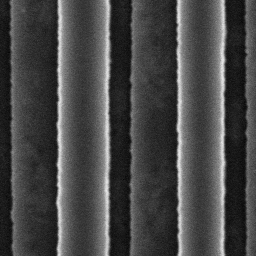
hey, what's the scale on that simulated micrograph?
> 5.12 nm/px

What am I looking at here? lines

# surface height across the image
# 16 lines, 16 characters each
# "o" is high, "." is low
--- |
....ooo....ooo..
....ooo....ooo..
....ooo....ooo..
....ooo....ooo..
....ooo....ooo..
....ooo....ooo..
....ooo....ooo..
....ooo....ooo..
....ooo....ooo..
....ooo....ooo..
....ooo....ooo..
....ooo....ooo..
....ooo....ooo..
....ooo....ooo..
....ooo....ooo..
....ooo....ooo..